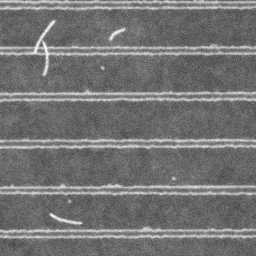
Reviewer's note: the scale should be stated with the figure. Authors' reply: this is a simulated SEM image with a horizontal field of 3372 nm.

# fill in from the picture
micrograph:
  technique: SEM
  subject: lines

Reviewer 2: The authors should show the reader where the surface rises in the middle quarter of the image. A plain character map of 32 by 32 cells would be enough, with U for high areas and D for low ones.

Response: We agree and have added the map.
DDDDDDDDDDDDDDDDDDDDDDDDDDDDDDDD
DDDDDDDDDDDDDDDDDDDDDDDDDDDDDDDD
DDDDDDDDDDDDDDDDDDDDDDDDDDDDDDDD
DDDDDDDDDDDDDDDDDDDDDDDDDDDDDDDD
DDDDDDDDDDDDDDDDDDDDDDDDDDDDDDDD
DDDDDDDDDDDDDDDDDDDDDDDDDDDDDDDD
DDDDDDDDDDDDDDDDDDDDDDDDDDDDDDDD
UUUUUUUUUUUUUUUUUUUUUUUUUUUUUUUU
UUUUUUUUUUUUUUUUUUUUUUUUUUUUUUUU
DDDDDDDDDDDDDDDDDDDDDDDDDDDDDDDD
DDDDDDDDDDDDDDDDDDDDDDDDDDDDDDDD
DDDDDDDDDDDDDDDDDDDDDDDDDDDDDDDD
DDDDDDDDDDDDDDDDDDDDDDDDDDDDDDDD
DDDDDDDDDDDDDDDDDDDDDDDDDDDDDDDD
DDDDDDDDDDDDDDDDDDDDDDDDDDDDDDDD
DDDDDDDDDDDDDDDDDDDDDDDDDDDDDDDD
DDDDDDDDDDDDDDDDDDDDDDDDDDDDDDDD
DDDDDDDDDDDDDDDDDDDDDDDDDDDDDDDD
DDDDDDDDDDDDDDDDDDDDDDDDDDDDDDDD
UUUUUUUUUUUUUUUUUUUUUUUUUUUUUUUU
UUUUUUUUUUUUUUUUUUUUUUUUUUUUUUUU
DDDDDDDDDDDDDDDDDDDDDDDDDDDDDDDD
DDDDDDDDDDDDDDDDDDDDDDDDDDDDDDDD
DDDDDDDDDDDDDDDDDDDDDDDDDDDDDDDD
DDDDDDDDDDDDDDDDDDDDDDDDDDDDDDDD
DDDDDDDDDDDDDDDDDDDDDDDDDDDDDDDD
DDDDDDDDDDDDDDDDDDDDDDDDDDDDDDDD
DDDDDDDDDDDDDDDDDDDDDDDDDDDDDDDD
DDDDDDDDDDDDDDDDDDDDDDDDDDDDDDDD
DDDDDDDDDDDDDDDDDDDDDDDDDDDDDDDD
DDDDDDDDDDDDDDDDDDDDDDDDDDDDDDDD
UUUUUUUUUUUUUUUUUUUUUUUUUUUUUUUU